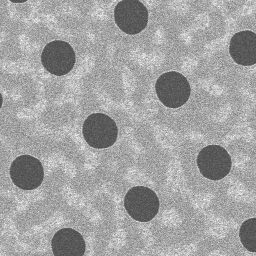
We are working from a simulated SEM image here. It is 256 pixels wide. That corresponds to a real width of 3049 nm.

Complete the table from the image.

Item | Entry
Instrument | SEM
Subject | holes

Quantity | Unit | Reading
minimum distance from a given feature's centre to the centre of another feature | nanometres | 999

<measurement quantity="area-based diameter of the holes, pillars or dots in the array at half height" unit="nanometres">424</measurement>